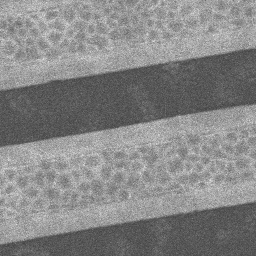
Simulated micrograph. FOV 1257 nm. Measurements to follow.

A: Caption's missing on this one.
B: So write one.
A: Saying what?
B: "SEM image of one or a few lines or trenches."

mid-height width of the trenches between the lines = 366 nanometres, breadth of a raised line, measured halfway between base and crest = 378 nm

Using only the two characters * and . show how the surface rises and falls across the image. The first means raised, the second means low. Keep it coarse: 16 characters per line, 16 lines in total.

****************
****************
***************.
*********.......
***.............
................
................
.............***
........********
..**************
****************
****************
*************...
*******.........
*...............
................